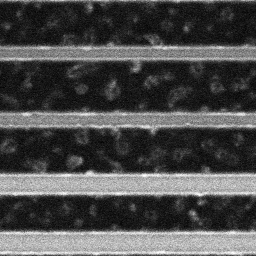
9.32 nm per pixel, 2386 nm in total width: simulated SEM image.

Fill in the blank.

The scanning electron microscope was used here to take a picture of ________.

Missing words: one or a few lines or trenches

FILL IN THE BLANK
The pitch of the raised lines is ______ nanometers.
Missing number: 592